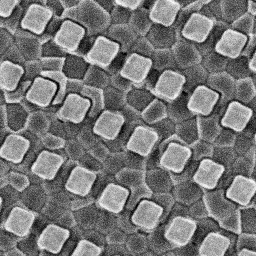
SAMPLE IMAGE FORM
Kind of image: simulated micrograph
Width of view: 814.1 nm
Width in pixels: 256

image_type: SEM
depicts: a regular array of raised bodies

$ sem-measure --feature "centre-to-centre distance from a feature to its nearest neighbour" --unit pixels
37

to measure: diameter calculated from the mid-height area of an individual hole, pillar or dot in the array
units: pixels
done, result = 27.3